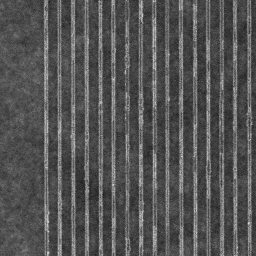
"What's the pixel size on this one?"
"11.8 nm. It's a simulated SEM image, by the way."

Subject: parallel lines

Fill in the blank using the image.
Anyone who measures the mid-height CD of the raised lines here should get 32.5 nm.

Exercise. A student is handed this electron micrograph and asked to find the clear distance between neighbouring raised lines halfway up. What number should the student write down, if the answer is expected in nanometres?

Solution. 129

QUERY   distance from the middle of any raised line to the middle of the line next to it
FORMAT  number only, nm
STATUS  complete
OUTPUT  160